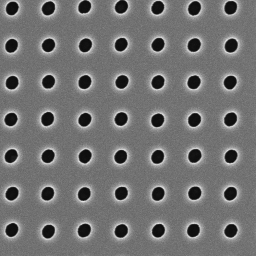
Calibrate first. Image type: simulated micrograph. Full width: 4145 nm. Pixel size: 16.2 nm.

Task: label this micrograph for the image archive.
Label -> a regular array of holes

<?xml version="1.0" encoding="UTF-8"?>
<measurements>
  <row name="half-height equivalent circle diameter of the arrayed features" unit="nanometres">220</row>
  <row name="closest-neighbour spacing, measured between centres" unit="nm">586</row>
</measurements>